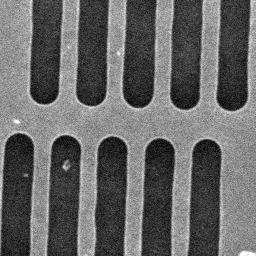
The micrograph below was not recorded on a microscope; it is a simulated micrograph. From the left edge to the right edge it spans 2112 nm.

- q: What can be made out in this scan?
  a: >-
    groups of lines, slits or small figures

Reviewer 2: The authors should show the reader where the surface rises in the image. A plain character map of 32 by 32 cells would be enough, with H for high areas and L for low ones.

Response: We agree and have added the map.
HHHHLLLLHHLLLLHHLLLLHHLLLHHLLLLH
HHHHLLLLHHLLLLHHLLLLHHLLLHHLLLLH
HHHHLLLLHHLLLLHHLLLLHHLLLHHLLLLH
HHHHLLLLHHLLLLHHLLLLHLLLLHHLLLLH
HHHHLLLLHHLLLLHHLLLLHLLLLHHLLLLH
HHHHLLLLHHLLLLHHLLLLHLLLLHHLLLLH
HHHHLLLLHHLLLLHLLLLLHLLLLHHLLLLH
HHHHLLLLHHLLLLHLLLLLHLLLLHHLLLLH
HHHHLLLLHHLLLLHLLLLLHLLLLHHLLLLH
HHHHLLLLHLLLLLHLLLLHHLLLLHHLLLLH
HHHHLLLHHLLLLHHLLLLHHLLLLHHLLLLH
HHHHLLLHHLLLLHHLLLLHHLLLLHHLLLLH
HHHHLLLHHHLLLHHHLLLHHLLLLHHLLLLH
HHHHHHHHHHHHHHHHHLHHHHLLHHHHLLHH
HHHHHHHHHHHHHHHHHHHHHHHHHHHHHHHH
HHHHHHHHHHHHHHHHHHHHHHHHHHHHHHHH
HHHHHHHHHHHHHHHHHHHHHHHHHHHHHHHH
HLLLHHHLLLHHHLLHHHHLLHHHHLLHHHHH
HLLLHHLLLLHHLLLLHHLLLLHHLLLLHHHH
LLLLHHLLLLHHLLLLHHLLLLHHLLLLHHHH
LLLLHHLLLLHHLLLLHHLLLLHHLLLLHHHH
LLLLHHLLLLHHLLLLHHLLLLHHLLLLHHHH
LLLLHHLLLLHHLLLLHHLLLLHHLLLLHHHH
LLLLHHLLLLHHLLLLHHLLLLHHLLLLHHHH
LLLLHHLLLLHHLLLLHHLLLLHHLLLLHHHH
LLLLHHLLLLHHLLLLHHLLLLHHLLLLHHHH
LLLLHHLLLLHHLLLLHHLLLLHHLLLLHHHH
LLLLHHLLLLHHLLLLHHLLLLHHLLLLHHHH
LLLLHHLLLLHHLLLLHHLLLLHHLLLLHHHH
LLLLHHLLLLHHLLLLHHLLLLHHLLLLHHHH
LLLLHHLLLLHHLLLLHHLLLLHHLLLLHHHH
LLLLHHLLLLHHLLLLHHLLLLHLLLLHHHHH